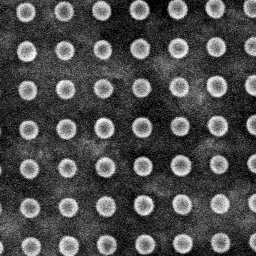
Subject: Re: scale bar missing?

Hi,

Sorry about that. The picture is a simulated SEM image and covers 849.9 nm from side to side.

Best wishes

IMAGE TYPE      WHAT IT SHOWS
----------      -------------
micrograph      a regular array of raised bodies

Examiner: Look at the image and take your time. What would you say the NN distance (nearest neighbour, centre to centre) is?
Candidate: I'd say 0.125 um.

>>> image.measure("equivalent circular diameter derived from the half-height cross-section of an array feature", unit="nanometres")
61.2